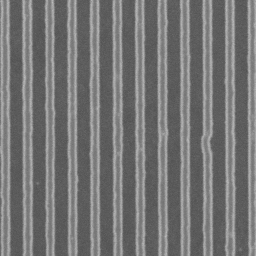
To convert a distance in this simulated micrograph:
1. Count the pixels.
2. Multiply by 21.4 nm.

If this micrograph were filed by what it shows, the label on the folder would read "parallel lines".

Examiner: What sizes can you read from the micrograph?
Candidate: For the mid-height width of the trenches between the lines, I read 335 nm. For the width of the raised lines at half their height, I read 131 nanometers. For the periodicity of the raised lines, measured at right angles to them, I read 0.482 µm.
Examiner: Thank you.